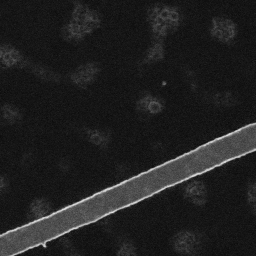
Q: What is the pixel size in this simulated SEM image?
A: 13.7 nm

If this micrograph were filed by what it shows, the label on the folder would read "one or a few lines or trenches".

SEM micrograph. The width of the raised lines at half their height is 333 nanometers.